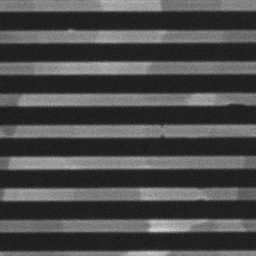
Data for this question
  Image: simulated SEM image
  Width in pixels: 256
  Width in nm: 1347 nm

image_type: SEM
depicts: parallel lines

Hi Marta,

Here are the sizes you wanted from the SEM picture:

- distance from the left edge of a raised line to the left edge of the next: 166 nm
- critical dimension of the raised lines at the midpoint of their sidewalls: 58.5 nm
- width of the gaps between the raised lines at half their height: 106 nm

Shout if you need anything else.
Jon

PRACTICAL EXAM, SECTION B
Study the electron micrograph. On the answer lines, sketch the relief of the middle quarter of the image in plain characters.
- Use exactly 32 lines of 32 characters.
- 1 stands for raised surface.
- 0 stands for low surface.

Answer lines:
11111111111111111111111111111111
11111111111111111111111111111111
00000000000000000000000000000000
00000000000000000000000000000000
00000000000000000000000000000000
00000000000000000000000000000000
00000000000000000000000000000000
00000000000000000000000000000000
11111111111111111111111111111111
11111111111111111111111111111111
00000000000000000000000000000000
00000000000000000000000000000000
00000000000000000000000000000000
00000000000000000000000000000000
00000000000000000000000000000000
11100000001000001111111101111100
11111111111111111111111111111111
11111111111111111111111111111111
00000000000000000000000000000000
00000000000000000000000000000000
00000000000000000000000000000000
00000000000000000000000000000000
00000000000000000000000000000000
11111111111111111111111111111111
11011111111111111111111111111111
11111111111111111111111111111111
00000000000000000000000000000000
00000000000000000000000000000000
00000000000000000000000000000000
00000000000000000000000000000000
00000000000000000000000000000000
11111111111111111111111111111111